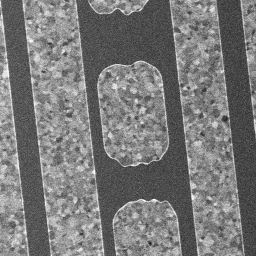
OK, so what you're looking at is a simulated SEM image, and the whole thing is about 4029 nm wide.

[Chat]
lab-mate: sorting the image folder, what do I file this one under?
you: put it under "one or a few lines or trenches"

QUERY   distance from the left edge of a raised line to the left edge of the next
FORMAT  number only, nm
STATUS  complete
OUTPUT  1120